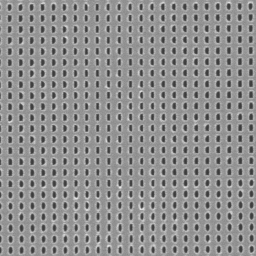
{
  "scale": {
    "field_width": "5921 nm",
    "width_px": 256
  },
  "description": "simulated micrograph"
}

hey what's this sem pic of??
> a regular array of holes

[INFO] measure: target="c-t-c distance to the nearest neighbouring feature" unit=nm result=253